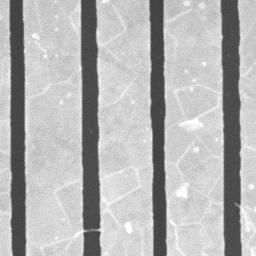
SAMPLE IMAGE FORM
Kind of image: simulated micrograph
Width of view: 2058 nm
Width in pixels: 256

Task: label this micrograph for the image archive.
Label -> lines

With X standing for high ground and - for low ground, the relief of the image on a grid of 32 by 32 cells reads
X--XXXXXXX--XXXXXXX--XXXXXX---XX
X--XXXXXXX--XXXXXXX--XXXXXXX--XX
X--XXXXXXX--XXXXXXX--XXXXXXX--XX
X--XXXXXXX--XXXXXXX--XXXXXXX--XX
X--XXXXXXX--XXXXXXX--XXXXXXX--XX
X--XXXXXXX--XXXXXXX--XXXXXXX--XX
X--XXXXXXX--XXXXXXX--XXXXXXX--XX
X--XXXXXXX--XXXXXXX--XXXXXXX--XX
X--XXXXXXX--XXXXXXX--XXXXXXX--XX
X--XXXXXXX--XXXXXXX--XXXXXXX--XX
X--XXXXXXX--XXXXXXX--XXXXXXX--XX
X--XXXXXXX--XXXXXXX--XXXXXXX--XX
X--XXXXXXX--XXXXXXX--XXXXXXX--XX
X--XXXXXXX--XXXXXXX--XXXXXXX--XX
X--XXXXXXX--XXXXXXX--XXXXXXX--XX
X--XXXXXXX--XXXXXXX--XXXXXXX--XX
X--XXXXXXX--XXXXXXX--XXXXXXX--XX
X--XXXXXXX--XXXXXXX--XXXXXXX--XX
X--XXXXXXX--XXXXXXX--XXXXXXX--XX
X--XXXXXXX--XXXXXXX--XXXXXXX--XX
X--XXXXXXX--XXXXXXX--XXXXXXX--XX
X--XXXXXXX--XXXXXXX--XXXXXXX--XX
X--XXXXXXX--XXXXXXX--XXXXXXX--XX
X--XXXXXXX---XXXXXX--XXXXXXX--XX
X--XXXXXXX---XXXXXX--XXXXXXX--XX
X--XXXXXXX---XXXXXX--XXXXXXX--XX
X--XXXXXXX---XXXXXX--XXXXXXX--XX
X--XXXXXXX---XXXXXX--XXXXXXX--XX
X--XXXXXXX--XXXXXXX--XXXXXXX--XX
X--XXXXXXX---XXXXXX--XXXXXXX--XX
X--XXXXXXX---XXXXXX--XXXXXXX--XX
X--XXXXXXX---XXXXXX--XXXXXXX--XX